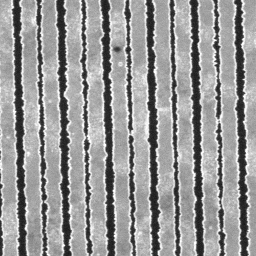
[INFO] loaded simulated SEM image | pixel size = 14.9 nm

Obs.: parallel lines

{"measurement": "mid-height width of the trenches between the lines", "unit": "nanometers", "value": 104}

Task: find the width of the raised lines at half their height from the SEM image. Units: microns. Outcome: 0.229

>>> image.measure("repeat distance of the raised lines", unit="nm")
329